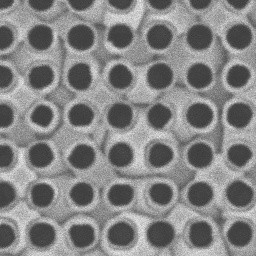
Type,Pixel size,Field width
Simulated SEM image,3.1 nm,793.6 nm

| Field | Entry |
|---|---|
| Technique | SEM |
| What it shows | a regular array of holes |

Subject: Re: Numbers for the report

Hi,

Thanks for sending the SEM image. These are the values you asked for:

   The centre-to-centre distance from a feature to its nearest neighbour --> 121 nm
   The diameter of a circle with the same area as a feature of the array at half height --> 0.077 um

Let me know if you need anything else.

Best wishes